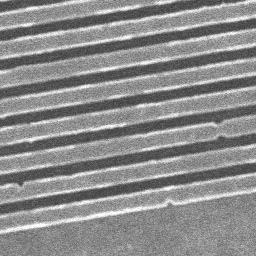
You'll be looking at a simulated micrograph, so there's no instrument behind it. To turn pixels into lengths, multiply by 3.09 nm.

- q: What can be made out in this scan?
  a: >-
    parallel lines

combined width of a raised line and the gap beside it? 88 nm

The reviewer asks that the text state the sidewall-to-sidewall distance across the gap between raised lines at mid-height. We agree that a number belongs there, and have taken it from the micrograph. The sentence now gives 32.7 nanometres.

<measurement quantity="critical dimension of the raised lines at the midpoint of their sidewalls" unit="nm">56.4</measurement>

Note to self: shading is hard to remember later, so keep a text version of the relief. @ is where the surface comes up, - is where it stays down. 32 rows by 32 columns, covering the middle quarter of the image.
@@@@@@@@@@@@@@@@@@--------------
@@@@@@@@@@@------------------@@@
@@@@@-----------------@@@@@@@@@@
----------------@@@@@@@@@@@@@@@@
----------@@@@@@@@@@@@@@@@@@@@@@
----@@@@@@@@@@@@@@@@@@@@@@@@@@@@
@@@@@@@@@@@@@@@@@@@@@@@@@@------
@@@@@@@@@@@@@@@@@@@-------------
@@@@@@@@@@@@@-----------------@@
@@@@@@@-----------------@@@@@@@@
@----------------@@@@@@@@@@@@@@@
------------@@@@@@@@@@@@@@@@@@@@
-----@@@@@@@@@@@@@@@@@@@@@@@@@@@
@@@@@@@@@@@@@@@@@@@@@@@@@@------
@@@@@@@@@@@@@@@@@@@@------------
@@@@@@@@@@@@@@@----------------@
@@@@@@@@@----------------@@@@@@@
@@-----------------@@@@@@@@@@@@@
-------------@@@@@@@@@@@@@@@@@@@
-------@@@@@@@@@@@@@@@@@@@@@@@@@
--@@@@@@@@@@@@@@@@@@@@@@@@@@----
@@@@@@@@@@@@@@@@@@@@@@----------
@@@@@@@@@@@@@@@@----------------
@@@@@@@@@@-----------------@@@@@
@@@@-----------------@@@@@@@@@@@
---------------@@@@@@@@@@@@@@@@@
---------@@@@@@@@@@@@@@@@@@@@@@@
---@@@@@@@@@@@@@@@@@@@@@@@@@----
@@@@@@@@@@@@@@@@@@@@@@----------
@@@@@@@@@@@@@@@@@@--------------
@@@@@@@@@@@----------------@-@@@
@@@@@----------------@@@@@@@@@@@